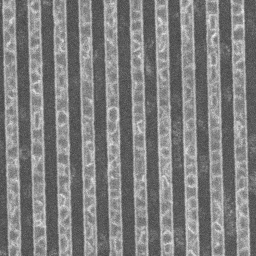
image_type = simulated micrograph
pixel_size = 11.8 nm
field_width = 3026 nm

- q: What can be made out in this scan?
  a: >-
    parallel lines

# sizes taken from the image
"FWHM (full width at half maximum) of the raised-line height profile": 12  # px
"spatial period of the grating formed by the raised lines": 25.4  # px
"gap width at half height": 162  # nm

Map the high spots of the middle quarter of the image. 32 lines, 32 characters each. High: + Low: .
+...+++....++....+++...+++....++
+...+++....++....+++...+++....++
+...+++....++....+++...+++....++
+...+++....++....+++...+++....++
+...+++....++....+++...+++....++
+...+++....++....+++...+++....++
+...+++....+++...+++...+++....++
+...+++....+++...+++...+++....++
+...+++....+++...+++...+++....++
+...+++....+++...+++...+++....++
+...+++....++....+++....+++...++
+...+++....+++...+++....++....++
+...+++....+++...+++....++....++
+...+++....+++...+++....+++...++
+...+++....+++...+++....+++...++
+....++....+++...+++....++....++
+....++....+++...+++....++....++
+....+++...+++...+++....++....++
+....++....+++...+++....++....++
+....++....+++....++....+++...++
+....+++...+++....++....+++...++
+....+++...+++....++....+++...++
+....++....+++....++....+++...++
+....++....+++....++....+++...++
+....+++...+++....++....+++...++
+....+++...+++....++....+++...++
+....+++...+++...+++....+++...++
+....+++...+++....++....+++...++
+....+++...+++....++....+++...++
+....+++...+++....+++...+++...++
+....+++...+++....+++...+++...++
+....+++...+++....+++...+++...++